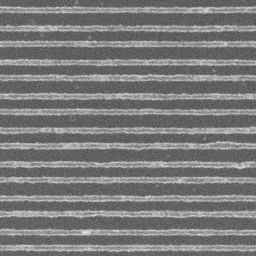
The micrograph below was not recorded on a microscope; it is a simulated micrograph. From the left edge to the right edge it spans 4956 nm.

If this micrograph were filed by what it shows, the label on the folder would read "parallel lines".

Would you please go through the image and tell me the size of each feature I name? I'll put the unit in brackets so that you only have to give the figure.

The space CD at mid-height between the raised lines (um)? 0.243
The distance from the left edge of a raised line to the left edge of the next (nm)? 329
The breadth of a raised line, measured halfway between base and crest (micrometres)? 0.0895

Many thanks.